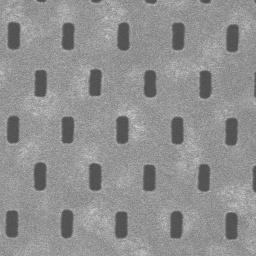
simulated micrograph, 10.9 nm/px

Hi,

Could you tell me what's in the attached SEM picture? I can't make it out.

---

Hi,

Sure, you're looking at a regular array of holes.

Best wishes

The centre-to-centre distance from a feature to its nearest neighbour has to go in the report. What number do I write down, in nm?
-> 588